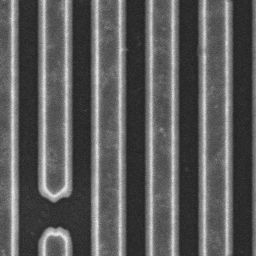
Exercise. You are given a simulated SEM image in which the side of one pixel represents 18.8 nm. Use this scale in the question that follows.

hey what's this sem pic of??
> parallel lines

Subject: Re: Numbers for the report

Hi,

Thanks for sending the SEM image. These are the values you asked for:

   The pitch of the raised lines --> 1010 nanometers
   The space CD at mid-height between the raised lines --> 0.499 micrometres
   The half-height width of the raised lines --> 513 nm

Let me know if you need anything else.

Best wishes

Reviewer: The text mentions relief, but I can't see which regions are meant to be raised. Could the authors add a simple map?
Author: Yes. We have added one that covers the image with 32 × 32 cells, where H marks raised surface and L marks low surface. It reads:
HHLLLHHHLLLLHHHLLLLHHHLLLHHHHLLL
HHLLLHHHLLLLHHHLLLLHHHLLLHHHHLLL
HHLLLHHHLLLLHHHLLLLHHHLLLHHHHLLL
HHLLLHHHLLLLHHHLLLLHHHLLLHHHHLLL
HHLLLHHHLLLLHHHLLLLHHHLLLHHHHLLL
HHLLLHHHLLLLHHHLLLLHHHLLLHHHHLLL
HHLLLHHHLLLLHHHLLLLHHHLLLHHHHLLL
HHLLLHHHLLLLHHHLLLLHHHLLLHHHHLLL
HHLLLHHHLLLLHHHLLLLHHHLLLHHHHLLL
HHLLLHHHHLLLHHHLLLLHHHLLLHHHHLLL
HHLLLHHHHLLLHHHLLLLHHHLLLHHHHLLL
HHLLLHHHHLLLHHHLLLLHHHLLLHHHHLLL
HHLLLHHHHLLLHHHLLLLHHHLLLHHHHLLL
HHLLLHHHHLLLHHHLLLLHHHLLLHHHHLLL
HHLLLHHHHLLLHHHLLLLHHHLLLHHHHLLL
HHLLLHHHHLLLHHHLLLLHHHLLLHHHHLLL
HHLLLHHHHLLLHHHLLLLHHHLLLHHHHLLL
HHLLLHHHHLLLHHHLLLLHHHLLLHHHHLLL
HHLLLHHHHLLLHHHLLLLHHHLLLHHHHLLL
HHLLLHHHHLLLHHHLLLLHHHLLLHHHHLLL
HHLLLHHHHLLLHHHLLLLHHHLLLHHHHLLL
HHLLLHHHHLLLHHHLLLLHHHLLLHHHHLLL
HHLLLHHHHLLLHHHLLLLHHHLLLHHHHLLL
HHLLLHHHHLLLHHHLLLLHHHLLLHHHHLLL
HHLLLLHLLLLLHHHLLLLHHHLLLHHHHLLL
HHLLLLLLLLLLHHHLLLLHHHLLLHHHHLLL
HHLLLLLLLLLLHHHLLLLHHHLLLHHHHLLL
HHLLLLLLLLLLHHHLLLLHHHLLLHHHHLLL
HHLLLLLLLLLLHHHLLLLHHHLLLHHHHLLL
HHLLLLHHLLLLHHHLLLLHHHLLLHHHHLLL
HHLLLHHHHLLLHHHLLLLHHHLLLHHHHLLL
HHLLLHHHHLLLHHHLLLLHHHLLLHHHHLLL